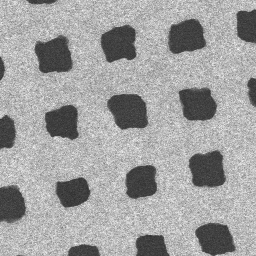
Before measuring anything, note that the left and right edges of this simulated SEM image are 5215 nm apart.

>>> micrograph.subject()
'a regular array of holes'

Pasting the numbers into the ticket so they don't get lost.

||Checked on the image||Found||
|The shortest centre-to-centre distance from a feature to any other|1360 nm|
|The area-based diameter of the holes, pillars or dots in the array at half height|720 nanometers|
